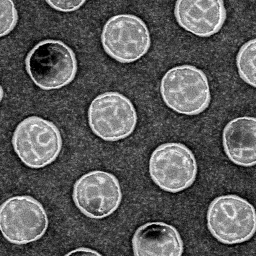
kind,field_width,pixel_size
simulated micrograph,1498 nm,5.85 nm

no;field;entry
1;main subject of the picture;raised bodies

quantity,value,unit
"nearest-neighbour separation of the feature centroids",460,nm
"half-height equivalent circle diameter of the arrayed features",0.272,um